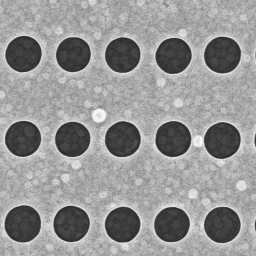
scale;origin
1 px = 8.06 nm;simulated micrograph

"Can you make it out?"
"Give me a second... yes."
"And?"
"a regular array of holes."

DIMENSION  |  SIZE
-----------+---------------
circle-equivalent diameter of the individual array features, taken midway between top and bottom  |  292 nm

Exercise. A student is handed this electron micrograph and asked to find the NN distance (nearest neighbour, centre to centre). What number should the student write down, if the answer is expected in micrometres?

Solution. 0.397